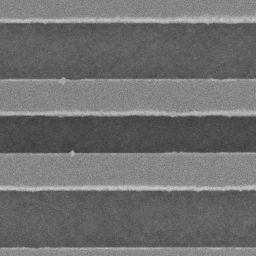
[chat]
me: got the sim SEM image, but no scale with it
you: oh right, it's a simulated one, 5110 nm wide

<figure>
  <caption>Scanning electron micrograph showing lines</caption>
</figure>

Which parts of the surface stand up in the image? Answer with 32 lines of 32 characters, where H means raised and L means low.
HHHHHHHHHHHHHHHHHHHHHHHHHHHHHHHH
HHHHHHHHHHHHHHHHHHHHHHHHHHHHHHHH
HHHHHHHHHHHHHHHHHHHHHHHHHHHHHHHH
LLLLLLLLLLLLLLLLLLLLLLLLLLLLLLLL
LLLLLLLLLLLLLLLLLLLLLLLLLLLLLLLL
LLLLLLLLLLLLLLLLLLLLLLLLLLLLLLLL
LLLLLLLLLLLLLLLLLLLLLLLLLLLLLLLL
LLLLLLLLLLLLLLLLLLLLLLLLLLLLLLLL
LLLLLLLLLLLLLLLLLLLLLLLLLLLLLLLL
LLLLLLLLLLLLLLLLLLLLLLLLLLLLLLLL
HHHHHHHHHHHHHHHHHHHHHHHHHHHHHHHH
HHHHHHHHHHHHHHHHHHHHHHHHHHHHHHHH
HHHHHHHHHHHHHHHHHHHHHHHHHHHHHHHH
HHHHHHHHHHHHHHHHHHHHHHHHHHHHHHHH
LLLLLLLLLLLLLLLLLLLLLHLLLLLLLLLL
LLLLLLLLLLLLLLLLLLLLLLLLLLLLLLLL
LLLLLLLLLLLLLLLLLLLLLLLLLLLLLLLL
LLLLLLLLLLLLLLLLLLLLLLLLLLLLLLLL
LLLLLLLLLLLLLLLLLLLLLLLLLLLLLLLL
HHHHHHHHHHHHHHHHHHHHHHHHHHHHHHHH
HHHHHHHHHHHHHHHHHHHHHHHHHHHHHHHH
HHHHHHHHHHHHHHHHHHHHHHHHHHHHHHHH
HHHHHHHHHHHHHHHHHHHHHHHHHHHHHHHH
HHHHHHHHHHHHHHHHHHHHHHHHHHHHHHHH
LLLLLLLLLLLLLLLLLLLLLLLLLLLLLLLL
LLLLLLLLLLLLLLLLLLLLLLLLLLLLLLLL
LLLLLLLLLLLLLLLLLLLLLLLLLLLLLLLL
LLLLLLLLLLLLLLLLLLLLLLLLLLLLLLLL
LLLLLLLLLLLLLLLLLLLLLLLLLLLLLLLL
LLLLLLLLLLLLLLLLLLLLLLLLLLLLLLLL
LLLLLLLLLLLLLLLLLLLLLLLLLLLLLLLL
HHHHHHHHHHHHHHHHHHHHHHHHHHHHHHHH